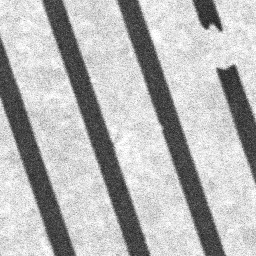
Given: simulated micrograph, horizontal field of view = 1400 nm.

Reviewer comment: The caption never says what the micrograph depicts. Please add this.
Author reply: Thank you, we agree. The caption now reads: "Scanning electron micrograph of one or a few lines or trenches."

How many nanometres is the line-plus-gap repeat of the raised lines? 391